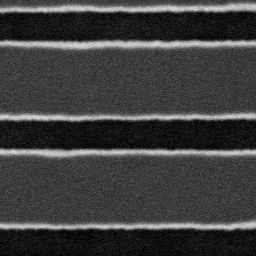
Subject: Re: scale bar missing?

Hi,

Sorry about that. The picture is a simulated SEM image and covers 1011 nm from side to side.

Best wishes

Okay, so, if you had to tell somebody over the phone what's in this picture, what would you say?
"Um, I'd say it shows lines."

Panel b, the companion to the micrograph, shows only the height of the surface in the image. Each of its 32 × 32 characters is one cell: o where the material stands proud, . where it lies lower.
oooooooooooooooooooooooooooooooo
................................
................................
................................
................................
oooooooooooooooooooooooooooooooo
oooooooooooooooooooooooooooooooo
oooooooooooooooooooooooooooooooo
oooooooooooooooooooooooooooooooo
oooooooooooooooooooooooooooooooo
oooooooooooooooooooooooooooooooo
oooooooooooooooooooooooooooooooo
oooooooooooooooooooooooooooooooo
oooooooooooooooooooooooooooooooo
oooooooooooooooooooooooooooooooo
................................
................................
................................
................................
oooooooooooooooooooooooooooooooo
oooooooooooooooooooooooooooooooo
oooooooooooooooooooooooooooooooo
oooooooooooooooooooooooooooooooo
oooooooooooooooooooooooooooooooo
oooooooooooooooooooooooooooooooo
oooooooooooooooooooooooooooooooo
oooooooooooooooooooooooooooooooo
oooooooooooooooooooooooooooooooo
ooooooooooo.ooooooooooo.ooooooo.
................................
................................
................................